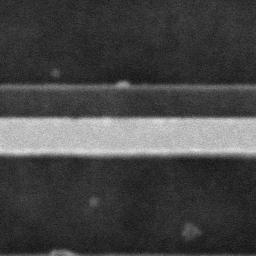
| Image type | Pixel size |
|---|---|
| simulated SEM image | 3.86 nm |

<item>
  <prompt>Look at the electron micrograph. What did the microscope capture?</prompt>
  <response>lines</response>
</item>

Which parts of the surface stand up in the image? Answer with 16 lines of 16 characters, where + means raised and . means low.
................
................
................
................
................
++++++++++++++++
++++++++++++++++
++++++++++++++++
++++++++++++++++
++++++++++++++++
................
................
................
................
................
................